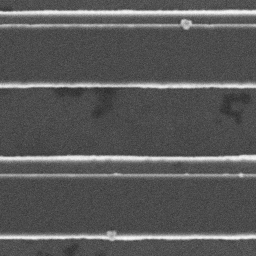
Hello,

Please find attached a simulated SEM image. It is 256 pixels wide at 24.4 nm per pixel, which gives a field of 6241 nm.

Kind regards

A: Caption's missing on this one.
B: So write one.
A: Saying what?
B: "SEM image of lines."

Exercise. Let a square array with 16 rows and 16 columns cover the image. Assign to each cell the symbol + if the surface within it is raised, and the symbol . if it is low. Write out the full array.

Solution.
................
++++++++++++++++
++++++++++++++++
++++++++++++++++
++++++++++++++++
................
................
................
................
................
++++++++++++++++
++++++++++++++++
++++++++++++++++
++++++++++++++++
++++++++++++++++
................